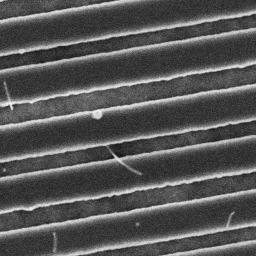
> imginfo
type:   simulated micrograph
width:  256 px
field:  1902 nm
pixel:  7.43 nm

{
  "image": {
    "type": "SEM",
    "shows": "lines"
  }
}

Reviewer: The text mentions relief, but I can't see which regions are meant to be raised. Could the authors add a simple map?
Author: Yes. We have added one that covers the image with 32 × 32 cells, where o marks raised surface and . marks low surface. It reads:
............oooooooooooooooooooo
......oooooooooooooooooooooooooo
ooooooooooooooooooooooooooo.....
ooooooooooooooooooooo...........
ooooooooooooooo...........oooooo
ooooooooo...........oooooooooooo
ooo...........oooooooooooooooooo
........oooooooooooooooooooooooo
..ooooooooooooooooooooooooooo...
ooooooooooooooooooooooo.........
ooooooooooooooooo...............
ooooooooooo...............oooooo
ooooo...............oooooooooooo
..............oooooooooooooooooo
........oooooooooooooooooooooooo
..ooooooooooooooooooooooooooo...
ooooooooooooooooooooooo.........
ooooooooooooooooo............ooo
oooooooooo.............ooooooooo
oooo.............ooooooooooooooo
...........ooooooooooooooooooooo
.....oooooooooooooooooooooooooo.
ooooooooooooooooooooooooo.......
ooooooooooooooooooo.............
ooooooooooooo..............ooooo
ooooooo..............ooooooooooo
o..............ooooooooooooooooo
.........ooooooooooooooooooooooo
...ooooooooooooooooooooooooooo..
oooooooooooooooooooooooo........
oooooooooooooooooo...........ooo
oooooooooooo...........ooooooooo